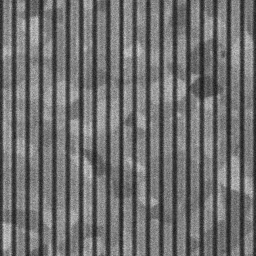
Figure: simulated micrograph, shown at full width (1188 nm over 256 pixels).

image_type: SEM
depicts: parallel lines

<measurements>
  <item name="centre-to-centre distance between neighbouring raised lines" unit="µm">0.0622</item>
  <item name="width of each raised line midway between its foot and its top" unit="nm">39.4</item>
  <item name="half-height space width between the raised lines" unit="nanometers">26.1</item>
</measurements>